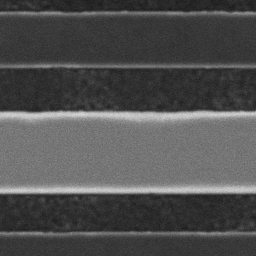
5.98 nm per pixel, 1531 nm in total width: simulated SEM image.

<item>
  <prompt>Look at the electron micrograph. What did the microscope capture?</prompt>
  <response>lines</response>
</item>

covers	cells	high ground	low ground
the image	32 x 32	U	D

DDDDDDDDDDDDDDDDDDDDDDDDDDDDDDDD
DDDDDDDDDDDDDDDUDDDDDDDDDDUUDDDD
UUUUUUUUUUUUUUUUUUUUUUUUUUUUUUUU
UUUUUUUUUUUUUUUUUUUUUUUUUUUUUUUU
UUUUUUUUUUUUUUUUUUUUUUUUUUUUUUUU
UUUUUUUUUUUUUUUUUUUUUUUUUUUUUUUU
UUUUUUUUUUUUUUUUUUUUUUUUUUUUUUUU
UUUUUUUUUUUUUUUUUUUUUUUUUUUUUUUU
DDDDDDDDDDDDDDDDDDDDDDDDDUUDDDDD
DDDDDDDDDDDDDDDDDDDDDDDDDDDDDDDD
DDDDDDDDDDDDDDDDDDDDDDDDDDDDDDDD
DDDDDDDDDDDDDDDDDDDDDDDDDDDDDDDD
DDDDDDDDDDDDDDDDDDDDDDDDDDDDDDDD
DDDDDDDDDDDDDDDDDDDDDDDDDDDDDDDD
UUUUUUUUUUUUUUUUUUUUUUUUUUUUUUUU
UUUUUUUUUUUUUUUUUUUUUUUUUUUUUUUU
UUUUUUUUUUUUUUUUUUUUUUUUUUUUUUUU
UUUUUUUUUUUUUUUUUUUUUUUUUUUUUUUU
UUUUUUUUUUUUUUUUUUUUUUUUUUUUUUUU
UUUUUUUUUUUUUUUUUUUUUUUUUUUUUUUU
UUUUUUUUUUUUUUUUUUUUUUUUUUUUUUUU
UUUUUUUUUUUUUUUUUUUUUUUUUUUUUUUU
UUUUUUUUUUUUUUUUUUUUUUUUUUUUUUUU
UUUUUUUUUUUUUUUUUUUUUUUUUUUUUUUU
DDDDDDDDDDDDDDDDDDDDDDDDDDDDDDDD
DDDDDDDDDDDDDDDDDDDDDDDDDDDDDDDD
DDDDDDDDDDDDDDDDDDDDDDDDDDDDDDDD
DDDDDDDDDDDDDDDDDDDDDDDDDDDDDDDD
DDDDDDDDDDDDDDDDDDDDDDDDDDDDDDDD
UUUUUUUUUUUUUUUUUUUUUUUUUUUUUUUU
UUUUUUUUUUUUUUUUUUUUUUUUUUUUUUUU
UUUUUUUUUUUUUUUUUUUUUUUUUUUUUUUU